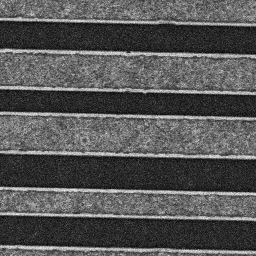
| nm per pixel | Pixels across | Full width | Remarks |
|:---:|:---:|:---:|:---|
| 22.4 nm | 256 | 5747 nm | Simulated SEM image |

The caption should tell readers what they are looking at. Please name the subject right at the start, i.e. one or a few lines or trenches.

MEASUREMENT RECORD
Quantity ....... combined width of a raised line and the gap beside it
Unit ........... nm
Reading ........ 1480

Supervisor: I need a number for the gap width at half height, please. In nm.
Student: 718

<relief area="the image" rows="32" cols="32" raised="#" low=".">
################################
################################
.....###########################
................................
................................
................................
#####...........................
################################
################################
################################
################################
.........................#######
................................
................................
###############.................
################################
################################
################################
################################
.......................#########
................................
................................
................................
................................
################################
################################
################################
................................
................................
................................
................................
#########################.......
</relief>